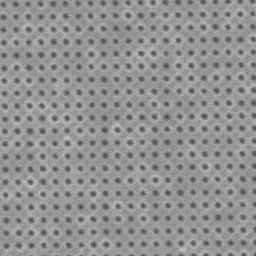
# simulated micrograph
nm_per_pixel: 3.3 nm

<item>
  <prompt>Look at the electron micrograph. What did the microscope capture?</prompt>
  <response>a regular array of holes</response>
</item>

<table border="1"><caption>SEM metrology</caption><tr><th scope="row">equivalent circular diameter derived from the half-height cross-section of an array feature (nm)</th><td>21.1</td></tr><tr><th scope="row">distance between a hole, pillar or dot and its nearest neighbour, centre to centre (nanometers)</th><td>40.2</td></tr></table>